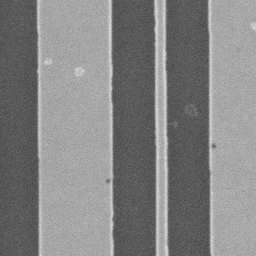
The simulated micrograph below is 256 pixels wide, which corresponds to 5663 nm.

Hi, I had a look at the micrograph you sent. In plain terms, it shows lines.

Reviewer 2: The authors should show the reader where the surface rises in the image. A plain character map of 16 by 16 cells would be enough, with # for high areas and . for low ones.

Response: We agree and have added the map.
..#####......###
..#####......###
..#####......###
..#####......###
..#####......###
..#####......###
..#####......###
..#####......###
..#####......###
..#####......###
..#####......###
..#####......###
..#####......###
..#####......###
..#####......###
..#####......###